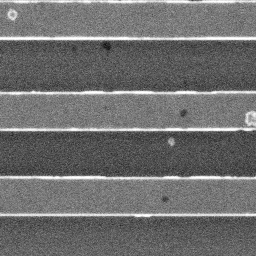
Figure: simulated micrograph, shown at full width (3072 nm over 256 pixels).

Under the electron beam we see lines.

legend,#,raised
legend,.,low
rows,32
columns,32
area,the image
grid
################################
################################
################################
################################
################################
................................
................................
................................
................................
................................
................................
................................
################################
################################
################################
################################
................................
................................
................................
................................
................................
................................
################################
################################
################################
################################
################################
................................
................................
................................
................................
................................